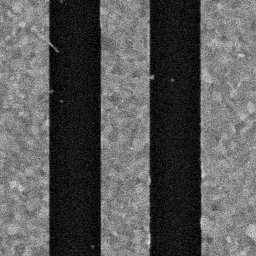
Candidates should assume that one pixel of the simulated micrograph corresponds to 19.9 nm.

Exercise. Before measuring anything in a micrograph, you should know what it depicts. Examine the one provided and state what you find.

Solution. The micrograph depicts lines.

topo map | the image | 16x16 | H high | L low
HHHLLLHHHLLLLHHH
HHHLLLHHHLLLLHHH
HHHLLLHHHLLLLHHH
HHHLLLHHHLLLLHHH
HHHLLLHHHLLLLHHH
HHHLLLHHHLLLLHHH
HHHLLLHHHLLLLHHH
HHHLLLHHHLLLLHHH
HHHLLLHHHLLLLHHH
HHHLLLHHHLLLLHHH
HHHLLLHHHLLLLHHH
HHHLLLHHHLLLLHHH
HHHLLLHHHLLLLHHH
HHHLLLHHHLLLLHHH
HHHLLLHHHLLLLHHH
HHHLLLHHHLLLLHHH